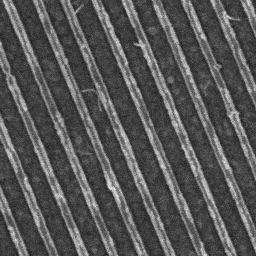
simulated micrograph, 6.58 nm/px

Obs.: parallel lines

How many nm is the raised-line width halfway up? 49.4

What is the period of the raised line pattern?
180 nanometers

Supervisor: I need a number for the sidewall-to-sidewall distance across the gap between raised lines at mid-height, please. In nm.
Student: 131